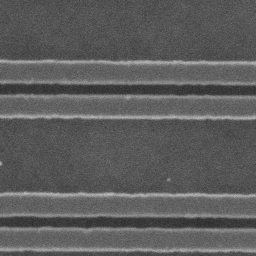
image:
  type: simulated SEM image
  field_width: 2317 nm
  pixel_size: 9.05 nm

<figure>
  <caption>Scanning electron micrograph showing lines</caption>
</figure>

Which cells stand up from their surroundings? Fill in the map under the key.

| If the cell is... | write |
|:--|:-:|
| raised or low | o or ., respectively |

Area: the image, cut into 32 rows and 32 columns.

................................
................................
................................
................................
................................
................................
................................
................................
oooooooooooooooooooooooooooooooo
oooooooooooooooooooooooooooooooo
..............................oo
................................
oooooooooooooooooooooooooooooooo
oooooooooooooooooooooooooooooooo
oooooooooooooooooooooooooooooooo
................................
................................
................................
................................
................................
................................
................................
................................
................................
oooooooooooooooooooooooooooooooo
oooooooooooooooooooooooooooooooo
oooooooooooooooooooooooooooooooo
................................
.....o..........................
oooooooooooooooooooooooooooooooo
oooooooooooooooooooooooooooooooo
................................